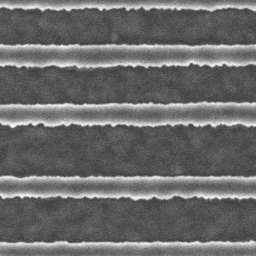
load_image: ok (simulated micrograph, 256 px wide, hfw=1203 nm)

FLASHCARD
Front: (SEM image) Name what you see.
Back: lines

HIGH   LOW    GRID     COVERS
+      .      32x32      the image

++++++++++++++++++++++++++++++++
................................
................................
................................
................................
................................
++++++++++++++++++++++++++++++++
++++++++++++++++++++++++++++++++
................................
................................
................................
................................
................................
++++++++++++++++++++++++++++++++
++++++++++++++++++++++++++++++++
.++.+++++.+++.+.++++++..+++++.++
................................
................................
................................
................................
................................
................................
++++++++++++++++++++++++++++++++
++++++++++++++++++++++++++++++++
++++++++++++++++++++++++++++++++
................................
................................
................................
................................
................................
++++++++++++++++++++++++++++++++
++++++++++++++++++++++++++++++++